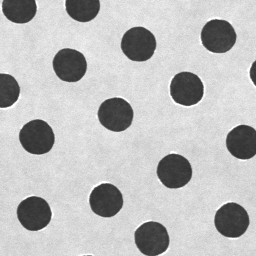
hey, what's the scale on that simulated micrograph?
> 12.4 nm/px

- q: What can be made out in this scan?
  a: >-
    a regular array of holes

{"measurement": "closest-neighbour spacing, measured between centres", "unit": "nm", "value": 874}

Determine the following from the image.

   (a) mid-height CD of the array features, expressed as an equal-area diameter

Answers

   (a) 436 nm